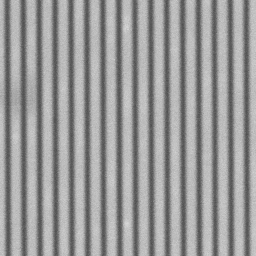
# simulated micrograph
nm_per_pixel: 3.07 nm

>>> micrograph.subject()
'parallel lines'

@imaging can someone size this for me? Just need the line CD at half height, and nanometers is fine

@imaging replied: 30.3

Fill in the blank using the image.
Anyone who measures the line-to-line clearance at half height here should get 18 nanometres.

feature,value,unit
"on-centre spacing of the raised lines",48.9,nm